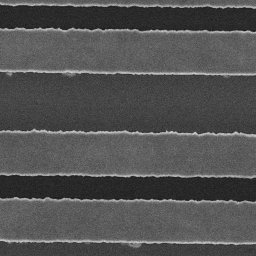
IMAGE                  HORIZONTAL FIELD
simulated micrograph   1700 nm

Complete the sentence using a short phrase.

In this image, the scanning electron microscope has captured lines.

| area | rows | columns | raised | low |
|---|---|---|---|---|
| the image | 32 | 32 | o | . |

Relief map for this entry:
oooooooooooooooooooooooooooooooo
................................
................................
..o.............................
oooooooooooooooooooooooooooooooo
oooooooooooooooooooooooooooooooo
oooooooooooooooooooooooooooooooo
oooooooooooooooooooooooooooooooo
oooooooooooooooooooooooooooooooo
................................
................................
................................
................................
................................
................................
................................
oooooooooooooooo....oo..........
oooooooooooooooooooooooooooooooo
oooooooooooooooooooooooooooooooo
oooooooooooooooooooooooooooooooo
oooooooooooooooooooooooooooooooo
oooooooooooooooooooooooooooooooo
................................
................................
................................
oooooooooooooooooooooooooooooooo
oooooooooooooooooooooooooooooooo
oooooooooooooooooooooooooooooooo
oooooooooooooooooooooooooooooooo
oooooooooooooooooooooooooooooooo
.............................o..
................................